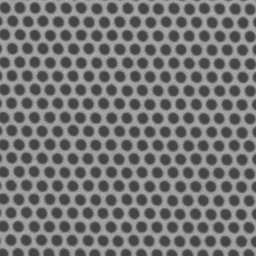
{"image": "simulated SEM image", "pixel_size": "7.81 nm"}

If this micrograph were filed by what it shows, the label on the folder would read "a regular array of holes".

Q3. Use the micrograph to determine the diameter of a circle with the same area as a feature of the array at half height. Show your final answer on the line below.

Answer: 86.8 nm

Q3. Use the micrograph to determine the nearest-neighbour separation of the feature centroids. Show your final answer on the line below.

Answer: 118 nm